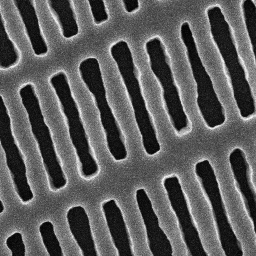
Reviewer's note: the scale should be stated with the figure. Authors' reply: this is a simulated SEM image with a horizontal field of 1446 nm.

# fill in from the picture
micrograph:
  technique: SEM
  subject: holes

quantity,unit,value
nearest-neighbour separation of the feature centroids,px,33.5